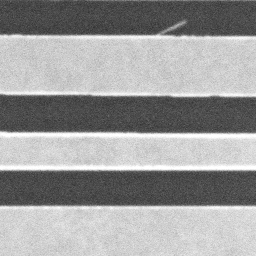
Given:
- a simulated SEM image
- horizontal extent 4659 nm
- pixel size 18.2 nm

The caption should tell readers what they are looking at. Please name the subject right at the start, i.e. lines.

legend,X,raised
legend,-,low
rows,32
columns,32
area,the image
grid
--------------------------------
--------------------------------
--------------------------------
--------------------------------
-X------------------------------
XXXXXXXXXXXXXXXXXXXXXXXXXXXXXXXX
XXXXXXXXXXXXXXXXXXXXXXXXXXXXXXXX
XXXXXXXXXXXXXXXXXXXXXXXXXXXXXXXX
XXXXXXXXXXXXXXXXXXXXXXXXXXXXXXXX
XXXXXXXXXXXXXXXXXXXXXXXXXXXXXXXX
XXXXXXXXXXXXXXXXXXXXXXXXXXXXXXXX
XXXXXXXXXXXXXXXXXXXXXXXXXXXXXXXX
--------------------------------
--------------------------------
--------------------------------
--------------------------------
--------------------------------
XXXXXXXXXXXXXXXXXXXXXXXXXXXXXXXX
XXXXXXXXXXXXXXXXXXXXXXXXXXXXXXXX
XXXXXXXXXXXXXXXXXXXXXXXXXXXXXXXX
XXXXXXXXXXXXXXXXXXXXXXXXXXXXXXXX
--------------------------------
--------------------------------
--------------------------------
--------------------------------
--------------------------------
XXXXXXXXXXXXXXXXXXXXXXXXXXXXXXXX
XXXXXXXXXXXXXXXXXXXXXXXXXXXXXXXX
XXXXXXXXXXXXXXXXXXXXXXXXXXXXXXXX
XXXXXXXXXXXXXXXXXXXXXXXXXXXXXXXX
XXXXXXXXXXXXXXXXXXXXXXXXXXXXXXXX
XXXXXXXXXXXXXXXXXXXXXXXXXXXXXXXX